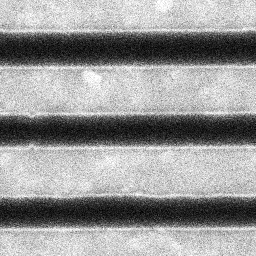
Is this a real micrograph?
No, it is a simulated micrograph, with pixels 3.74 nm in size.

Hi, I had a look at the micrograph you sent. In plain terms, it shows one or a few lines or trenches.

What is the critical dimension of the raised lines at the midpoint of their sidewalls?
133 nanometers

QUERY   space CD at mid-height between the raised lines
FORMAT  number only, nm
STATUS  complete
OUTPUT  168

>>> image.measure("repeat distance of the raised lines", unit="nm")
306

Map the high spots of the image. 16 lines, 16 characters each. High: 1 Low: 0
0000000000000000
0000000000000000
1111111111111111
1111111111111111
0000010000000000
0000000000000000
0000000000000000
1111111111111111
1111111111111111
0000000000000000
0000000000000000
0000000000000000
1111111111111111
1111111111111111
0000000000000000
0000000000000000